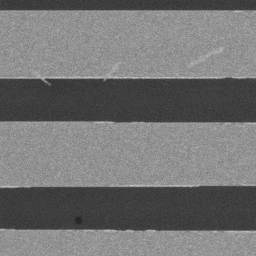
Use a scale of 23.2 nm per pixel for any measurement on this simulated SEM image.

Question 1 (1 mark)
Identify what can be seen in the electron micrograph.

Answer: lines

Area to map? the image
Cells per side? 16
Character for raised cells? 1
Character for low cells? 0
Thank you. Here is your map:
0000000000000000
1111111111111111
1111111111111111
1111111111111111
1111111111111111
0000000000000000
0000000000000000
0000000000000000
1111111111111111
1111111111111111
1111111111111111
1111111111111111
0000000000000000
0000000000000000
1111111111111111
1111111111111111